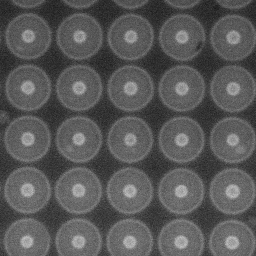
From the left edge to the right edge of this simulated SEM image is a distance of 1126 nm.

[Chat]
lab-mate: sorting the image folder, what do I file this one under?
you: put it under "an array of small figures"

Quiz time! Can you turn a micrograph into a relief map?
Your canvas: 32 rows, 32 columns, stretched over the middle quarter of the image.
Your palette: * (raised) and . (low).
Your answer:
********************************
*......*******.....********.....
........*****........*****......
.........***.........****.......
.........***..........***.......
...**....**....***....**....***.
...**....**....***....**....***.
.........***..........**.....*..
........****.........****.......
........****.........****.......
*.....********......******......
*****************************.**
********************************
***.************.***************
*......*******......******......
........****........*****.......
.........***.........****.......
.........***..........**........
..***....**....***....**....***.
...**....**....***....**....***.
.........**..........***........
.*......****.........****.......
........*****.......*****.......
*.....********.....********.....
********************************
********************************
**...**********...***********.**
*......******.......******......
........****.........****.......
........****.........****.......
...**....**...........**........
..***....**....***....**....***.